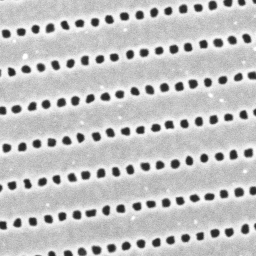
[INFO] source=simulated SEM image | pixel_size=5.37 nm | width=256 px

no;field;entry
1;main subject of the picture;a regular array of holes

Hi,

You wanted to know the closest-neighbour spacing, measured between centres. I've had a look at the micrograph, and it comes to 78.3 nanometers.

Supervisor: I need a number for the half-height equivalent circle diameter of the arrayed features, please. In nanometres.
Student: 48.5